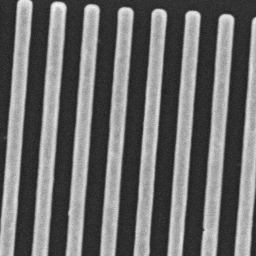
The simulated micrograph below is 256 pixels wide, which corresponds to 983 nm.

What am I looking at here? parallel lines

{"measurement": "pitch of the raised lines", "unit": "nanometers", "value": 129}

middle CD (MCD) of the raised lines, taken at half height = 0.0532 microns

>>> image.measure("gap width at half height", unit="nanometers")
74.2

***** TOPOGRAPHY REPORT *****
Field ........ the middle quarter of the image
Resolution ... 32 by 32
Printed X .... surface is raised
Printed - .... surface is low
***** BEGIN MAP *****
----XXXX-----XXX-----XXXX-----XX
----XXXX-----XXX-----XXXX-----XX
----XXX------XXX-----XXX------XX
----XXX------XXX-----XXX-----XXX
----XXX------XXX-----XXX-----XXX
----XXX-----XXXX-----XXX-----XXX
----XXX-----XXXX-----XXX-----XXX
----XXX-----XXXX-----XXX-----XXX
----XXX-----XXXX-----XXX-----XXX
----XXX-----XXX-----XXXX-----XXX
----XXX-----XXX-----XXXX-----XXX
----XXX-----XXX-----XXXX-----XXX
---XXXX-----XXX-----XXXX-----XXX
---XXXX-----XXX-----XXXX-----XXX
---XXXX-----XXX-----XXXX-----XXX
---XXX------XXX-----XXX------XXX
---XXX------XXX-----XXX-----XXXX
---XXX------XXX-----XXX-----XXXX
---XXX-----XXXX-----XXX-----XXXX
---XXX-----XXXX-----XXX-----XXX-
---XXX-----XXXX-----XXX-----XXXX
---XXX-----XXXX-----XXX-----XXX-
--XXXX-----XXX-----XXXX-----XXX-
--XXXX-----XXX-----XXXX-----XXX-
---XXX-----XXX-----XXXX-----XXX-
--XXXX-----XXX-----XXXX-----XXX-
--XXXX-----XXX-----XXXX-----XXX-
--XXXX-----XXX-----XXXX-----XXX-
--XXX------XXX-----XXXX-----XXX-
--XXX------XXX-----XXX-----XXXX-
--XXX------XXX-----XXX-----XXXX-
--XXX-----XXXX-----XXX-----XXXX-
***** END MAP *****